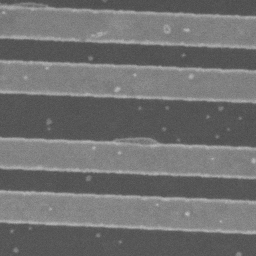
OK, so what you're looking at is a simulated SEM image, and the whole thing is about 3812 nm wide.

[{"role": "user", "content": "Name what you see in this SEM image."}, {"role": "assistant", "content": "lines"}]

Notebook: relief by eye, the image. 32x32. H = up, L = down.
LLLLLLLLLLLLLLLLLLLLLLLLLLLLLLLL
HHHHHHHHHHHHHHHHHLLLLLLLLLLLLLLL
HHHHHHHHHHHHHHHHHHHHHHHHHHHHHHHH
HHHHHHHHHHHHHHHHHHHHHHHHHHHHHHHH
HHHHHHHHHHHHHHHHHHHHHHHHHHHHHHHH
LLLLLLLLLLLLLLLLLLHHHHHHHHHHHHHH
LLLLLLLLLLLLLLLLLLLLLLLLLLLLLLLL
LLLLLLLLLLLLLLLLLLLLLLLLLLLLLLLL
HHHHHHHHHHHHHHHHHHHHHHLLLLLLLLLL
HHHHHHHHHHHHHHHHHHHHHHHHHHHHHHHH
HHHHHHHHHHHHHHHHHHHHHHHHHHHHHHHH
HHHHHHHHHHHHHHHHHHHHHHHHHHHHHHHH
LLLLLLLLLLLLLLLLLLLLLLLHHHHHHHHH
LLLLLLLLLLLLLLLLLLLLLLLLLLLLLLLL
LLLLLLLLLLLLLLLLLLLLLLLLLLLLLLLL
LLLLLLLLLLLLLLLLLLLLLLLLLLLLLLLL
LLLLLLLLLLLLLLLLLLLLLLLLLLLLLLLL
HHHHHHLLLLLLLLLLHHHLLLLLLLLLLLLL
HHHHHHHHHHHHHHHHHHHHHHHHHHHHHHLL
HHHHHHHHHHHHHHHHHHHHHHHHHHHHHHHH
HHHHHHHHHHHHHHHHHHHHHHHHHHHHHHHH
LLLLLLLLLLLLHHHHHHHHHHHHHHHHHHHH
LLLLLLLLLLLLLLLLLLLLLLLLLLLLLLLL
LLLLLLLLLLLLLLLLLLLLLLLLLLLLLLLL
HHHHHHHHHHHHHHHLLLLLLLLLLLLLLLLL
HHHHHHHHHHHHHHHHHHHHHHHHHHHHHHHH
HHHHHHHHHHHHHHHHHHHHHHHHHHHHHHHH
HHHHHHHHHHHHHHHHHHHHHHHHHHHHHHHH
LLLLLLLLLLLLLLLLHHHHHHHHHHHHHHHH
LLLLLLLLLLLLLLLLLLLLLLLLLLLLLLLL
LLLLLLLLLLLLLLLLLLLLLLLLLLLLLLLL
LLLLLLLLLLLLLLLLLLLLLLLLLLLLLLLL